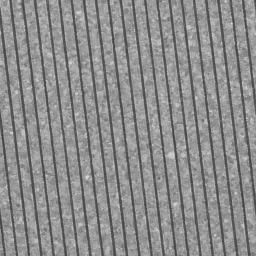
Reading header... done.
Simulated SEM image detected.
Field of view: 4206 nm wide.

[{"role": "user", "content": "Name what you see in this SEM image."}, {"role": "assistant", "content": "parallel lines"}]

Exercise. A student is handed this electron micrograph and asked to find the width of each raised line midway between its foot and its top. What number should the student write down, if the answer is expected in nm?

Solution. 147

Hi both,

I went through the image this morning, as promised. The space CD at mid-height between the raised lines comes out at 3.1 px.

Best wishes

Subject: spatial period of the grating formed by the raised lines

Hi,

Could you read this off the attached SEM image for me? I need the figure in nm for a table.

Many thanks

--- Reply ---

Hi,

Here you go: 200